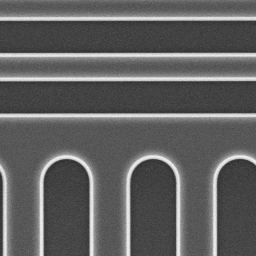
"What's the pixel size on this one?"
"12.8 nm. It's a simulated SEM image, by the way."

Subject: groups of lines, slits or small figures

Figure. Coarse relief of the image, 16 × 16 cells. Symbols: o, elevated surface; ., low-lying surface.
oooooooooooooooo
................
................
oooooooooooooooo
oooooooooooooooo
................
................
oooooooooooooooo
oooooooooooooooo
oooooooooooooooo
ooo..ooo...ooo..
ooo...oo...oo...
ooo...oo...oo...
ooo...oo...oo...
ooo...oo...oo...
ooo...oo...oo...